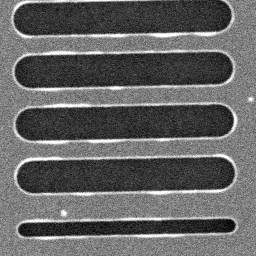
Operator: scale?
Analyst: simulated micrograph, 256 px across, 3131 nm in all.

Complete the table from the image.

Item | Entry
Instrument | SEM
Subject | groups of lines, slits or small figures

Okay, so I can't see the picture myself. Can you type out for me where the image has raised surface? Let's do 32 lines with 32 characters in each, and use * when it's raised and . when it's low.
***.........................****
**...........................***
**...........................***
**..........................****
***....*************************
********************************
*****************...........****
**...........................***
**...........................***
**...........................***
**..........................****
********************************
********************************
****.........................***
**...........................***
**...........................***
**...........................***
***..............***************
********************************
********************************
***..........................***
**...........................***
**...........................***
**..........................****
********************************
********************************
********************************
****************.............***
**...........................***
***..................***********
********************************
********************************